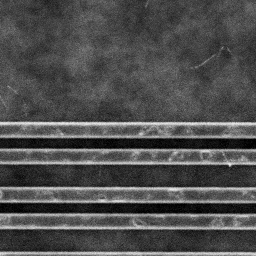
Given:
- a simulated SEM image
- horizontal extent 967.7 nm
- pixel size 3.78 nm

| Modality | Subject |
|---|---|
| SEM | parallel lines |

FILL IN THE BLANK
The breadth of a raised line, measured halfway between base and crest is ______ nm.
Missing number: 56.7